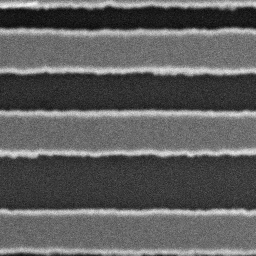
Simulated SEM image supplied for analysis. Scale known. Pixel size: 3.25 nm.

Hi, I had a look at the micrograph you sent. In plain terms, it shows lines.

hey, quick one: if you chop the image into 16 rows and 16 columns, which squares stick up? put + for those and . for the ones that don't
..+.............
................
++++++++++++++++
++++++++++++++++
+++++++++.++++++
................
................
++++++++++++++++
++++++++++++++++
++++++++++++++++
................
................
................
++++++++++++++++
++++++++++++++++
++++++++++++++++